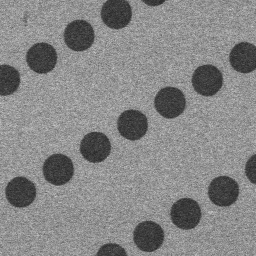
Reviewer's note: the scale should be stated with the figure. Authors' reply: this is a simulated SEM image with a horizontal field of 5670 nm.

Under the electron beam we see a regular array of holes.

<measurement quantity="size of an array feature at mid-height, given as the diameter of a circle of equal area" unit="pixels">31.6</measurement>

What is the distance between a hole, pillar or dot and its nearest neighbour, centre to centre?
963 nm